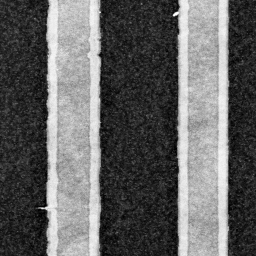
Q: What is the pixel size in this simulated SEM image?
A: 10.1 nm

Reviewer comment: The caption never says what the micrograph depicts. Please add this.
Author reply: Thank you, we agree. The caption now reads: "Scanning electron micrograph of one or a few lines or trenches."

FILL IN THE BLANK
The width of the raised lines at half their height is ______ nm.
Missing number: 394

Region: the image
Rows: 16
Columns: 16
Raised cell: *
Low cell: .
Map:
...***......**..
...***......**..
...***.....***..
...***.....***..
...***......**..
...***......**..
...***......**..
...***.....***..
...***.....***..
...***.....***..
...***......**..
...***.....***..
...***.....***..
...***.....***..
...***......**..
...***.....***..